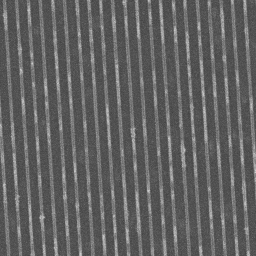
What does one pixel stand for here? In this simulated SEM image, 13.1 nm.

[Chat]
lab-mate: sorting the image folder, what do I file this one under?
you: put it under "parallel lines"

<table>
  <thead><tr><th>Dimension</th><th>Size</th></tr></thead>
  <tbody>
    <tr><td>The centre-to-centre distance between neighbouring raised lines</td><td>156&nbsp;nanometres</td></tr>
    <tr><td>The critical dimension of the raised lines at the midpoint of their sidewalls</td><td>32.6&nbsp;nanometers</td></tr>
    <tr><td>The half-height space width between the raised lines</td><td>122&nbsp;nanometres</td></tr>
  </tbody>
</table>